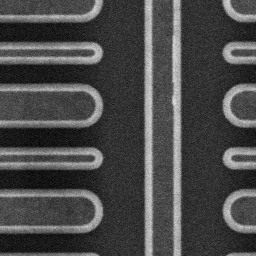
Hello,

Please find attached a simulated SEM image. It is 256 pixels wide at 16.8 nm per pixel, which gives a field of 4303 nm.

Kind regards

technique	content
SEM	groups of lines, slits or small figures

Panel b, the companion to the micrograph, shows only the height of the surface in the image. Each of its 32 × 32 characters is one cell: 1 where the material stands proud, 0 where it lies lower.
11111111111100000001110000001111
11111111111100000001110000000111
00000000000000000001110000000000
00000000000000000001110000000000
00000000000000000001110000000000
00000000000000000001110000000000
11111111111100000001110000001111
11111111111100000001110000000111
00000000000000000001110000000000
00000000000000000001110000000000
00000000000000000001110000000000
11111111111100000001110000000111
11111111111100000001110000001111
11111111111100000001110000001111
11111111111100000001110000000111
11111111111000000001110000000011
00000000000000000001110000000000
00000000000000000001110000000000
00000000000000000001110000000000
11111111111100000001110000001111
11111111111100000001110000000111
00000000000000000001110000000000
00000000000000000001110000000000
00000000000000000001110000000000
11111111111000000001110000000111
11111111111100000001110000001111
11111111111100000001110000001111
11111111111100000001110000000111
11111111111000000001110000000011
00000000000000000001110000000000
00000000000000000001110000000000
00000000000000000001110000000000